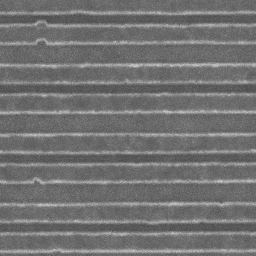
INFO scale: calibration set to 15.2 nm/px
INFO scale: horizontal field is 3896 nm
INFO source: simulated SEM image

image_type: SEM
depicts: parallel lines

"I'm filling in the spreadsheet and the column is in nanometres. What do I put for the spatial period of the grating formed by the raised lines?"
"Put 528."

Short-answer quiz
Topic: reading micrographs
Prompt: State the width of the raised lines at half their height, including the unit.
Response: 274 nanometres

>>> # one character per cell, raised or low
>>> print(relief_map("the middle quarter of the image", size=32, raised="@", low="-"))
@@@@@@@@@@@@@@@@@@@@@@@@@@@@@@@@
@@@@@@@@@@@@@@@@@@@@@@@@@@@@@@@@
@@@@@@@@@@@@@@@@@@@@@@@@@@@@@@@@
@@@@@@@@@@@@@@@@@@@@@@@@@@@@@@@@
@@@@@@@@@@@@@@@-@@@@@@@@@@@@@@@@
--------------------------------
--------------------------------
---------@-@----@@------@@------
@@@@@@@@@@@@@@@@@@@@@@@@@@@@@@@@
@@@@@@@@@@@@@@@@@@@@@@@@@@@@@@@@
@@@@@@@@@@@@@@@@@@@@@@@@@@@@@@@@
@@@@@@@@@@@@@@@@@@@@@@@@@@@@@@@@
--------------------------------
--------------------------------
--------------------------------
--------------------------------
--------------------------------
------@-------------------------
@@@@@@@@@@@@@@@@@@@@@@@@@@@@@@@@
@@@@@@@@@@@@@@@@@@@@@@@@@@@@@@@@
@@@@@@@@@@@@@@@@@@@@@@@@@@@@@@@@
@@@@@@@@@@@@@@@@@@@@@@@@@@@@@@@@
--------------------------------
--------------------------------
--------------------------------
@@@@@@@@@@@@@@@@@@@@@@@@@@@@@@@@
@@@@@@@@@@@@@@@@@@@@@@@@@@@@@@@@
@@@@@@@@@@@@@@@@@@@@@@@@@@@@@@@@
@@@@@@@@@@@@@@@@@@@@@@@@@@@@@@@@
@@-------@@-@@--@-@---@@--@---@-
--------------------------------
--------------------------------